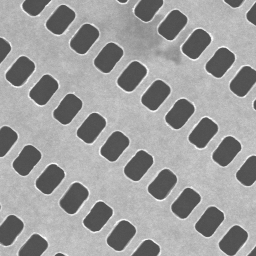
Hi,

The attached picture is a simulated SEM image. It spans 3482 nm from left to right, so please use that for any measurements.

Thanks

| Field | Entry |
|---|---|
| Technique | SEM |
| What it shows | a regular array of holes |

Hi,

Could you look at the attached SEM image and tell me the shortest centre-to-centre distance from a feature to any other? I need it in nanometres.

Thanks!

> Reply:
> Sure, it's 410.